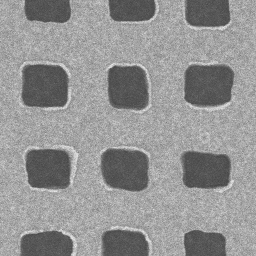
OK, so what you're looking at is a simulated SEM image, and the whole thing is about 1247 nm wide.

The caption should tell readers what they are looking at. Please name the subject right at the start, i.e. holes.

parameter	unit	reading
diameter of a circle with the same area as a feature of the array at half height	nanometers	224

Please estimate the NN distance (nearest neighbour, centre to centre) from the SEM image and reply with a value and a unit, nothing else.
392 nm